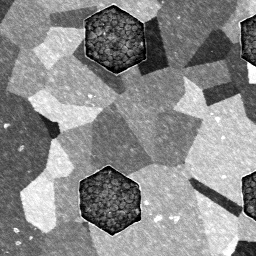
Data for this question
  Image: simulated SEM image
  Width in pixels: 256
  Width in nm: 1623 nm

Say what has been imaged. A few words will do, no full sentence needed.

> holes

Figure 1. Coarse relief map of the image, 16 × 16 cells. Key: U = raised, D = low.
UUUUUUUUUUUUUUUU
UUUUUDDDDUUUUUUD
UUUUUDDDDUUUUUUD
UUUUUUDDDUUUUUUD
UUUUUUUDUUUUUUUU
UUUUUUUUUUUUUUUU
UUUUUUUUUUUUUUUU
UUUUUUUUUUUUUUUU
UUUUUUUUUUUUUUUU
UUUUUUUUUUUUUUUU
UUUUUUUUUUUUUUUU
UUUUUDDDDUUUUUUD
UUUUUDDDDUUUUUUD
UUUUUDDDDUUUUUUU
UUUUUUUUUUUUUUUU
UUUUUUUUUUUUUUUU